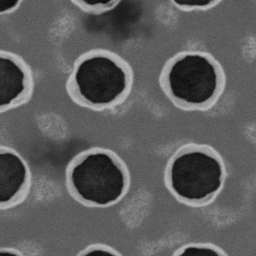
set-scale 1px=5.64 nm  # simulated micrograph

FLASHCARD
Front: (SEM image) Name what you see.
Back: holes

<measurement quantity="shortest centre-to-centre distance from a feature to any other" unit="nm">528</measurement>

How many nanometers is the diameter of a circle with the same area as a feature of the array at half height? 308